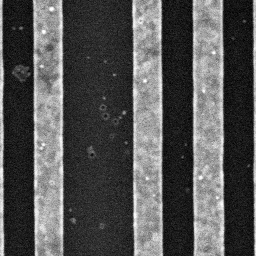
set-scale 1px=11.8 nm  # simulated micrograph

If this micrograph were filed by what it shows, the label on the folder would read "wiring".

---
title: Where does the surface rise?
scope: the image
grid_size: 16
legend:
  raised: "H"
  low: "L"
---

LLHHLLLLHHLLHHLL
LLHHLLLLHHLLHHLL
LLHHLLLLHHLLHHLL
LLHHLLLLHHLLHHLL
LLHHLLLLHHLLHHLL
LLHHLLLLHHLLHHLL
LLHHLLLLHHLLHHLL
LLHHLLLLHHLLHHLL
LLHHLLLLHHLLHHLL
LLHHLLLLHHLLHHLL
LLHHLLLLHHLLHHLL
LLHHLLLLHHLLHHLL
LLHHLLLLHHLLHHLL
LLHHLLLLHHLLHHLL
LLHHLLLLHHLLHHLL
LLHHLLLLHHLLHHLL